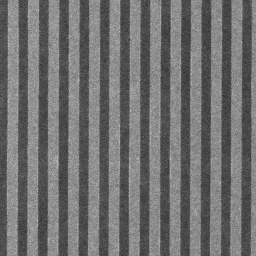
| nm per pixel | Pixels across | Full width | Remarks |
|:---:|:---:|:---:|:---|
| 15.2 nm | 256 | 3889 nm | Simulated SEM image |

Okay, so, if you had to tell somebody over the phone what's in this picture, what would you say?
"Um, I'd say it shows parallel lines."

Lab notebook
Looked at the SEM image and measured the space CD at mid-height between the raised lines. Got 154 nanometres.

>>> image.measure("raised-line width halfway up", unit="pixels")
10.1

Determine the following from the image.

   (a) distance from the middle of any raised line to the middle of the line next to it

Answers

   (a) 309 nm